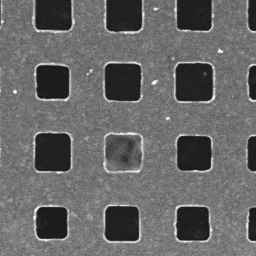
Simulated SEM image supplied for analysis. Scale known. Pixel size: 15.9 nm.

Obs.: a regular array of holes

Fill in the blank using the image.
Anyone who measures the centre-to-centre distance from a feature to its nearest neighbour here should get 1120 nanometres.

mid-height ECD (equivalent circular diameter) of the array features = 610 nm